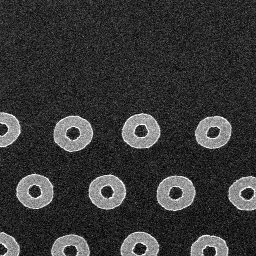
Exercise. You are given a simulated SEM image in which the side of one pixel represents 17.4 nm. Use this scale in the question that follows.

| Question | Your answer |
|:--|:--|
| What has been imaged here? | ring-shaped raised bodies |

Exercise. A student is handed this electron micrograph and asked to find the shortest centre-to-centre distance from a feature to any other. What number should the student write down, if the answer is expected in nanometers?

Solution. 1190